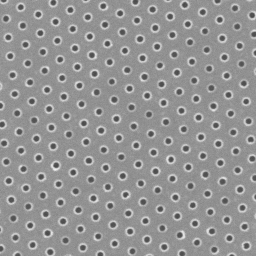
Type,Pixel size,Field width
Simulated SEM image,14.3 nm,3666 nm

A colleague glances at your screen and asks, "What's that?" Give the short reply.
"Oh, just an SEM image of a regular array of holes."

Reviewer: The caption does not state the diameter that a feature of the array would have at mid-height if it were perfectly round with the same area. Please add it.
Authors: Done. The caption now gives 6.48 px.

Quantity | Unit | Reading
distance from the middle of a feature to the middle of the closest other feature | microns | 0.265